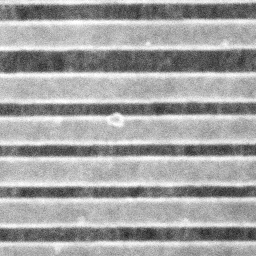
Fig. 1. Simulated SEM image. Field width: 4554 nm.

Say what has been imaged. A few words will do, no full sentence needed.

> lines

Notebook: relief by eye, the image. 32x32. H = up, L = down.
LLLLLLLLLLLLLLLLLLLLLLLLLLLLLLLL
LLLLLLLLLLLLLLLLLLLLLLLLLLLLLLLL
LLLLLLLLLLLLLLLLLLLLLLLLLLLLLLLL
HHHHHHHHHHHHHHHHHHHHHHHHHHHHHHHH
HHHHHHHHHHHHHHHHHHHHHHHHHHHHHHHH
HHHHHHHHHHHHHHHHHHHHHHHHHHHHHHHH
LLLLLLLLLLLLLLLLLLLLLLLLLLLLLLLL
LLLLLLLLLLLLLLLLLLLLLLLLLLLLLLLL
LLLLLLLLLLLLLLLLLLLLLLLLLLLLLLLL
HHHHHHHHHHHHHHHHHHHHHHHHHHHHHHHH
HHHHHHHHHHHHHHHHHHHHHHHHHHHHHHHH
HHHHHHHHHHHHHHHHHHHHHHHHHHHHHHHH
HHHHHHHHHHHHHHHHHHHHHHLLLLLHHHHH
LLLLLLLLLLLLLLLLLLLLLLLLLLLLLLLL
LLLLLLLLLLLLLLHLLLLLLLLLLLLLLLLL
HHHHHHHHHHHHHHHHHHHHHHHHHHHHHHHH
HHHHHHHHHHHHHHHHHHHHHHHHHHHHHHHH
HHHHHHHHHHHHHHHHHHHHHHHHHHHHHHHH
LLLLLLLLLLLLLLLLLLLLLLLLLLLLLLLL
LLLLLLLLLLLLLLLLLLLLLLLLLLLLLLLL
HHHHHHHHHHHHHHHHHHHHHHHHHHHHHHHH
HHHHHHHHHHHHHHHHHHHHHHHHHHHHHHHH
HHHHHHHHHHHHHHHHHHHHHHHHHHHHHHHH
LLLLLLLLLLLLLLLLLLLLLLLLLLLLLLLL
LLLLLLLLLLLLLLLLLLLLLLLLLLLLLLLL
HHHHHHHHHHHHHHHHHHHHHHHHHHHHHHHH
HHHHHHHHHHHHHHHHHHHHHHHHHHHHHHHH
HHHHHHHHHHHHHHHHHHHHHHHHHHHHHHHH
LLLLLLLLLLLLLLLLLLLLLLLLLLLLLLLL
LLLLLLLLLLLLLLLLLLLLLLLLLLLLLLLL
HHHHHHHHHHHHHHHHHHHHHHHHHHHHHHHH
HHHHHHHHHHHHHHHHHHHHHHHHHHHHHHHH